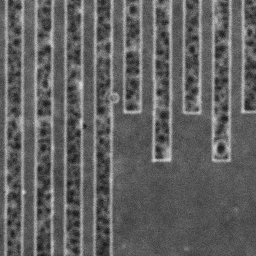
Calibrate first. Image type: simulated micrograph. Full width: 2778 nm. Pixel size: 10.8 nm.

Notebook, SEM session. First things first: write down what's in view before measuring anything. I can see parallel lines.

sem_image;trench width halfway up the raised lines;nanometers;144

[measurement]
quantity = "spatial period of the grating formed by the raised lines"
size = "29.6 px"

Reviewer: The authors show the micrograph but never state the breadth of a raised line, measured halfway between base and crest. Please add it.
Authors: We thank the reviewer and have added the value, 174 nm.